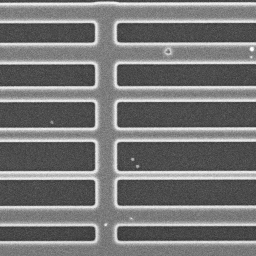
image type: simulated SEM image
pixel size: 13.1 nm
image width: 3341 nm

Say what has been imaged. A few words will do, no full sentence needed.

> groups of lines, slits or small figures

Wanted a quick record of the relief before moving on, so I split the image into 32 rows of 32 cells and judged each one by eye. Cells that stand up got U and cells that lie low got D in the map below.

DDDDDDDDDDDUUUUUUUUUUUUUUUUUUUUU
UUUUUUUUUUUUUUUUUUUUUUUUUUUUUUUU
UUUUUUUUUUUUUUUUUUUUUUUUUUUUUUUU
DDDDDDDDDDDDUUDDDDDDDDDDDDDDDDDD
DDDDDDDDDDDDUUDDDDDDDDDDDDDDDDDD
DDDDDDDDDDDUUUUDDDDDDDDDDDDDDDUU
UUUUUUUUUUUUUUUUUUUUUUUUUUUUUUUU
UUUUUUUUUUUUUUUUUUUUUUUUUUUUUUUU
DDDDDDDDDDDDUUUDDDDDDDDDDDDDDDDD
DDDDDDDDDDDDUUDDDDDDDDDDDDDDDDDD
DDDDDDDDDDDDUUUDDDDDDDDDDDDDDDDD
UUUUUUUUUUUUUUUUUUUUUUUUUUUUUUUU
UUUUUUUUUUUUUUUUUUUUUUUUUUUUUUUU
DDDDDDDDDDDDUUDDDDDDDDDDDDDDDDDD
DDDDDDDDDDDDUUDDDDDDDDDDDDDDDDDD
DDDDDDDDDDDDUUUDDDDDDDDDDDDDDDDD
UUUUUUUUUUUUUUUUUUUUUUUUUUUUUUUU
UUUUUUUUUUUUUUUUUUUUUUUUUUUUUUUU
DDDDDDDDDDDDUUDDDDDDDDDDDDDDDDDD
DDDDDDDDDDDDUUDDDDDDDDDDDDDDDDDD
DDDDDDDDDDDDUUDDDDDDDDDDDDDDDDDD
DDDDDDDDDDDUUUUDDDDDDDDDDDDDDDUU
DDDDDDDDDDDDUUUDDDDDDDDDDDDDDDDD
DDDDDDDDDDDDUUDDDDDDDDDDDDDDDDDD
DDDDDDDDDDDDUUDDDDDDDDDDDDDDDDDD
DDDDDDDDDDDDUUUDDDDDDDDDDDDDDDDD
UUUUUUUUUUUUUUUUUUUUUUUUUUUUUUUU
UUUUUUUUUUUUUUUUUUUUUUUUUUUUUUUU
DDDDDDDDDDDDUUUDDDDDDDDDDDDDDDDD
DDDDDDDDDDDDUUDDDDDDDDDDDDDDDDDD
UUUUUUUUUUUUUUUUUUUUUUUUUUUUUUUU
UUUUUUUUUUUUUUUUUUUUUUUUUUUUUUUU